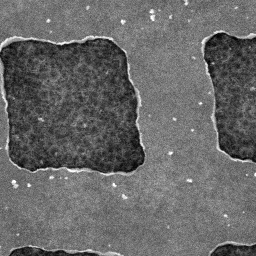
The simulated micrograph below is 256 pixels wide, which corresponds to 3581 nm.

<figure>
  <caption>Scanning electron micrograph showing holes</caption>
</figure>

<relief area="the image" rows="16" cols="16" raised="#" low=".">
################
################
#.###..######...
........#####...
........#####...
........#####...
.........####...
#........####...
#........#####..
#........#####..
#..#.....#######
################
################
################
################
#.############..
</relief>